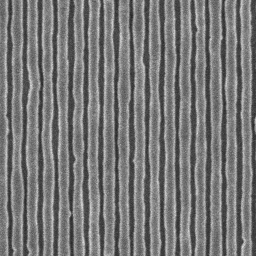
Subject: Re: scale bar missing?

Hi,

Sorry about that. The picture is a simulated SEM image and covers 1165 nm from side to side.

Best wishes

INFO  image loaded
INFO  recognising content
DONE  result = parallel lines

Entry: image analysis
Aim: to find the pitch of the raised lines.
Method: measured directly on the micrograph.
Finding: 69.5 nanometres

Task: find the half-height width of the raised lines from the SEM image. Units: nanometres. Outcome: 43.8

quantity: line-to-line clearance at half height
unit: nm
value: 26.1